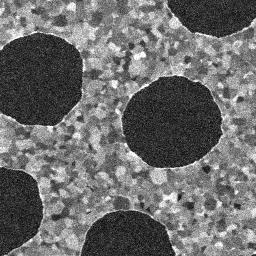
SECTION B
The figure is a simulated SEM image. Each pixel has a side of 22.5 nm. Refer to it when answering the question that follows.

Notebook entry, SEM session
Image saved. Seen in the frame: holes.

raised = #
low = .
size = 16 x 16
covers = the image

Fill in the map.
###########.....
###########.....
#...############
.....###########
.....###########
.....####....###
.....###......##
#...####......##
########......##
########.....###
##########.#####
..##############
...#############
...###...#######
..###.....######
.####......#####